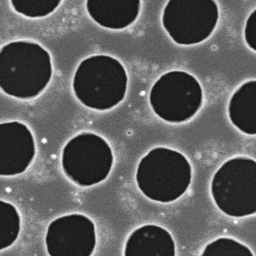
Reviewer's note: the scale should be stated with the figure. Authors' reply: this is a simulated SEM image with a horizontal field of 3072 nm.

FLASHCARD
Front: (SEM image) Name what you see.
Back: holes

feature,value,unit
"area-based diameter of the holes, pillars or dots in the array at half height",637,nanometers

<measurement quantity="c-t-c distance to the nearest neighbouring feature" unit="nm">932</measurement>